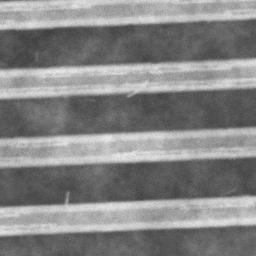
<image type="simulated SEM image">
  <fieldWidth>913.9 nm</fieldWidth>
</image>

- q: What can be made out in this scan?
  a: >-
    one or a few lines or trenches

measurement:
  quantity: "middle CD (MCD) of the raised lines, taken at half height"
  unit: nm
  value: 76.6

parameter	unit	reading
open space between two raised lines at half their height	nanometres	167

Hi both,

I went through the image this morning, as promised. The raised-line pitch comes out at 244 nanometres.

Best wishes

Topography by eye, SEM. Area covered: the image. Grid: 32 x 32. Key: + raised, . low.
.......+++++++++++++++++++++++++
++++++++++++++++++++++++++++++++
++++++++++++++++................
................................
................................
................................
................................
................................
..................++++++++++++++
++++++++++++++++++++++++++++++++
++++++++++++++++++++++++++++++++
++++++++........................
................................
................................
................................
................................
................................
.......+.+++++++++++++++++++++++
++++++++++++++++++++++++++++++++
++++++++++++++++++..............
................................
................................
................................
................................
................................
.......................+++++++++
++++++++++++++++++++++++++++++++
++++++++++++++++++++++++++++++++
+++++++++.......................
................................
................................
................................